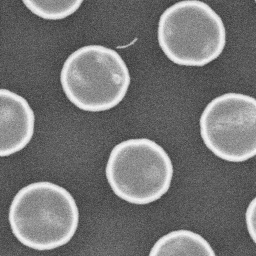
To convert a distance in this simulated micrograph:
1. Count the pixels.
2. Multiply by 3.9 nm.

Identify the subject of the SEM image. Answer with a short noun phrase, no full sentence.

raised bodies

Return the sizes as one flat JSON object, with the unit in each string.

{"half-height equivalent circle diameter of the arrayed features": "248 nanometers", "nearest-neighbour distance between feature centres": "407 nm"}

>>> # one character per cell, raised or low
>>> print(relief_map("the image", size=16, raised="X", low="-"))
--XXX------XX---
----------XXXX--
----------XXXX--
-----XX----XX---
----XXXX--------
----XXXX--------
XX---XX------XXX
XX-----------XXX
XX-----------XXX
X------XXX----XX
-------XXXX-----
-------XXX------
-XXX----X-------
-XXXX-----------
-XXXX-----------
----------XXX---